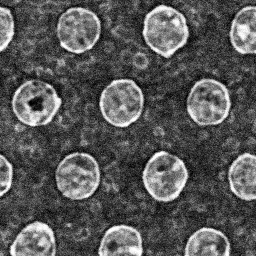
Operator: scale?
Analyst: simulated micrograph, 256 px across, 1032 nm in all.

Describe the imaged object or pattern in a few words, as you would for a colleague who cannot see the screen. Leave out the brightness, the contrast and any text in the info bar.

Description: raised bodies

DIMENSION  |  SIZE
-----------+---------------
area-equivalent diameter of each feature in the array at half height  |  181 nm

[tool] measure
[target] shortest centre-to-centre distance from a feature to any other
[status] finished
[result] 84.3 pixels